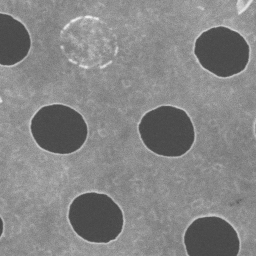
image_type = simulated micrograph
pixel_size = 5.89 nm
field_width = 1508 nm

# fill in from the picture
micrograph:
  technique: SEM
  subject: holes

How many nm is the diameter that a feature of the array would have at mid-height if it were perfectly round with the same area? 313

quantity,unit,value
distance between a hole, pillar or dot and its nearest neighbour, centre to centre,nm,568